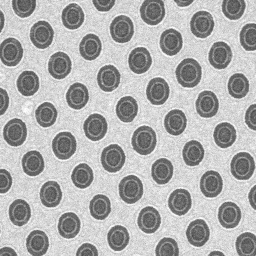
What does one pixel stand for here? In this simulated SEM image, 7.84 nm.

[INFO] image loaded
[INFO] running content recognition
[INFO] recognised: a regular array of ring-shaped grooves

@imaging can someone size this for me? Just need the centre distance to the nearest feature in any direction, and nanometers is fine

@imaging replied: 278